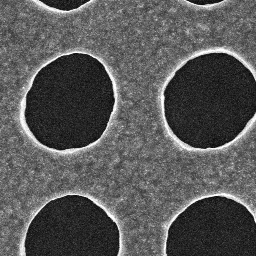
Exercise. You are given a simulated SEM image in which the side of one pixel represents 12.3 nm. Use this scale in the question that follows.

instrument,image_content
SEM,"holes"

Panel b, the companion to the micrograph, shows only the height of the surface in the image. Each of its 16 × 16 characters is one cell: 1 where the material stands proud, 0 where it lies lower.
1110011111111111
1111111111111111
1111111111111111
1111001111110001
1100000111100000
1100000111000000
1100000111000000
1100000111000000
1100001111100001
1111111111111111
1111111111111111
1111111111111111
1110001111111001
1100000111100000
1100000111100000
1000000111000000